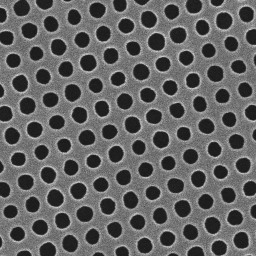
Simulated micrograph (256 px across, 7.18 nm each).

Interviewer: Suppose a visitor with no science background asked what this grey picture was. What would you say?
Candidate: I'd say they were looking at a regular array of holes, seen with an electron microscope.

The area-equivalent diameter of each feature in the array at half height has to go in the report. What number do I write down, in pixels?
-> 15.2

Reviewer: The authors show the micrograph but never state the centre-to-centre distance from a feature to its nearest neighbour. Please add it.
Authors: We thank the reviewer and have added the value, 23.3 px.